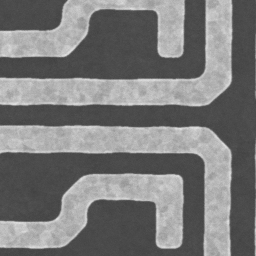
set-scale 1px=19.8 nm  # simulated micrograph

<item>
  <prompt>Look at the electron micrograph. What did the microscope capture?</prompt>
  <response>wiring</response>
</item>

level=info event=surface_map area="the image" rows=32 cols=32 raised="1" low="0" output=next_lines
00000000111111111111111000111000
00000000111100000001111000111000
00000000111000000000111000111000
00000001111000000000111000111000
11111111111000000000111000111000
11111111110000000000111000111000
11111111100000000000111000111000
00000000000000000000000000111000
00000000000000000000000000111000
00000000000000000000000001111000
11111111111111111111111111111000
11111111111111111111111111110000
11111111111111111111111111100000
00000000000000000000000000000000
00000000000000000000000000000000
00000000000000000000000000000000
11111111111111111111111111100000
11111111111111111111111111110000
11111111111111111111111111111000
00000000000000000000000001111000
00000000000000000000000000111000
00000000000000000000000000111000
00000000001111111111111000111000
00000000011111111111111000111000
00000000111111111111111000111000
00000000111000000001111000111000
00000000111000000000111000111000
00000001111000000000111000111000
11111111110000000000111000111000
11111111100000000000111000111000
11111111000000000000111000111000
00000000000000000000000000111000